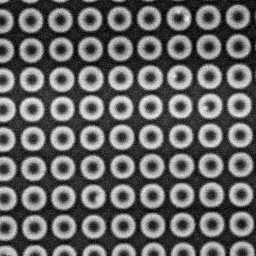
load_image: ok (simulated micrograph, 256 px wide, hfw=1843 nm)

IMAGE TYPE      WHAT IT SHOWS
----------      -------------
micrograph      an array of small figures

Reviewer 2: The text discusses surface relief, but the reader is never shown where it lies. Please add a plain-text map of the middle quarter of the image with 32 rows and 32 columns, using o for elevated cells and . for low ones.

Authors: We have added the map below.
............................oo..
o....oooo...oooo...ooooo...oooo.
oo..ooooo..oooooo..ooooo..oooooo
oo..oooooo.oooooo..ooooo..oooooo
oo..oooooo.oooooo..ooooo..oooooo
oo..ooooo...oooo...ooooo...oooo.
o.....oo........................
................................
o....ooo.....ooo....ooo....oooo.
oo..ooooo...ooooo..ooooo...ooooo
oo..oooooo..ooooo..ooooo..oooooo
oo..oooooo..ooooo..ooooo..oooooo
oo..ooooo...ooooo..ooooo...oooo.
o....ooo.....ooo.....oo.........
................................
..............o......o......oo..
oo...oooo...ooooo..ooooo...ooooo
oo..oooooo..ooooo..ooooo...ooooo
oo..oooooo..ooooo..oooooo.oooooo
oo..oooooo..ooooo..ooooo...ooooo
oo...oooo....ooo....oooo....ooo.
................................
................................
o.....ooo....oooo...oooo...ooooo
oo...ooooo..ooooo..oooooo..ooooo
oo..oooooo..ooooo..oooooo.oooooo
oo..oooooo..ooooo..oooooo..ooooo
oo...ooooo..ooooo...oooo...ooooo
o.....oo........................
................................
......oo......oo.....oo.....ooo.
oo...ooooo..ooooo...oooo...ooooo